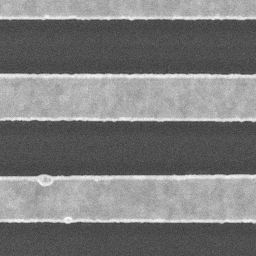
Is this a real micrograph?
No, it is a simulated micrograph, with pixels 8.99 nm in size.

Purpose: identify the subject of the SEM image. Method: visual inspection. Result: lines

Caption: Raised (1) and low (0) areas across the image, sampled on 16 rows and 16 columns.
1111111111111111
0000000000000000
0000000000000000
0000000000000000
0000000000000000
1111111111111111
1111111111111111
0001111111111111
0000000000000000
0000000000000000
0000000000000000
1111111111111111
1111111111111111
1111111111111111
0000000000000000
0000000000000000